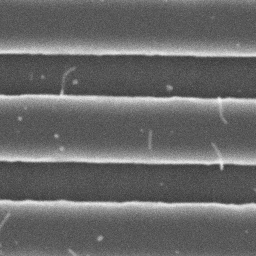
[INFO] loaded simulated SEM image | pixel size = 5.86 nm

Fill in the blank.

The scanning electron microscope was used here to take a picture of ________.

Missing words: lines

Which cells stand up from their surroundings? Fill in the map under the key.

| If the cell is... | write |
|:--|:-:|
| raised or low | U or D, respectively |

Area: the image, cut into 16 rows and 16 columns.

UUUUUUUUUUUUUUUU
UUUUUUUUUUUUUUUU
UUUUUUUUUUUUUUUU
DDDDDDDDDDDDDDDD
DDDDDDDDDDDDDDDD
DDDDDDDDDDDDDDDD
UUUUUUUUUUUUUUUU
UUUUUUUUUUUUUUUU
UUUUUUUUUUUUUUUU
UUUUUUUUUUUUUUUU
DDDDDDDDDDDDDDDD
DDDDDDDDDDDDDDDD
DDDDDDDDDDDDDDDD
UUUUUUUUUUUUUUUU
UUUUUUUUUUUUUUUU
UUUUUUUUUUUUUUUU